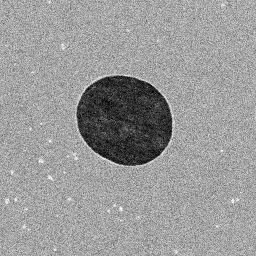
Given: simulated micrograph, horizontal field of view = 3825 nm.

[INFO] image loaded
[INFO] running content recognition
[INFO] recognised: holes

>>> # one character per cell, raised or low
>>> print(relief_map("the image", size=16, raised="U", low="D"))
UUUUUUUUUUUUUUUU
UUUUUUUUUUUUUUUU
UUUUUUUUUUUUUUUU
UUUUUUUUUUUUUUUU
UUUUUUUUUUUUUUUU
UUUUUDDDDDUUUUUU
UUUUUDDDDDDUUUUU
UUUUUDDDDDDUUUUU
UUUUUDDDDDDUUUUU
UUUUUUDDDDUUUUUU
UUUUUUUUUUUUUUUU
UUUUUUUUUUUUUUUU
UUUUUUUUUUUUUUUU
UUUUUUUUUUUUUUUU
UUUUUUUUUUUUUUUU
UUUUUUUUUUUUUUUU